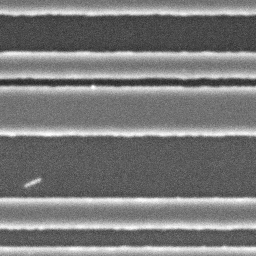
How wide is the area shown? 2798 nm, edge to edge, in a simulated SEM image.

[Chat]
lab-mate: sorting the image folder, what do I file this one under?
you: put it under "lines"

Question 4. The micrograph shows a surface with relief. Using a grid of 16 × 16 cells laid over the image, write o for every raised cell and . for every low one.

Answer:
oooooooooooooooo
................
................
oooooooooooooooo
oooooooooooooooo
oooooooooooooooo
oooooooooooooooo
oooooooooooooooo
................
................
................
................
oooooooooooooooo
oooooooooooooooo
oooooooooooooooo
oooooooooooooooo